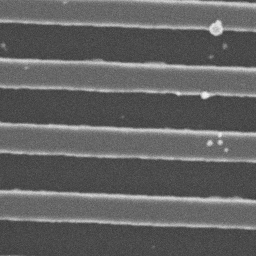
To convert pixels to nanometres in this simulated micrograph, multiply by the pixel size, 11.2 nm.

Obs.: lines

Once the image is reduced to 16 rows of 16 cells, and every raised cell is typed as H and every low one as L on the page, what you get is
HHHHHHHHHHHHHHHH
LLLHHHHHHHHHHHHH
LLLLLLLLLLLLLLLL
LLLLLLLLLLLLLLLL
HHHHHHHHHHHHHHHH
LHHHHHHHHHHHHHHH
LLLLLLLLLLLLLLLL
LLLLLLLLLLLLLLLL
HHHHHHHHHHHHHHHH
HHHHHHHHHHHHHHHH
LLLLLLLLLLLLLLLL
LLLLLLLLLLLLLLLL
HHHHHHHHHHHHHHHH
HHHHHHHHHHHHHHHH
LLLLLLLLLLLLLLLL
LLLLLLLLLLLLLLLL